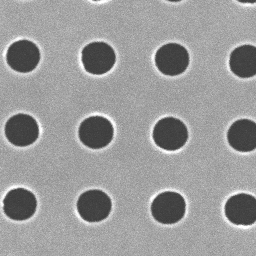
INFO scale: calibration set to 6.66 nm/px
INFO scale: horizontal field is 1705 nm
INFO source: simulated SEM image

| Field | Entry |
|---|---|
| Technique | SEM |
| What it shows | a regular array of holes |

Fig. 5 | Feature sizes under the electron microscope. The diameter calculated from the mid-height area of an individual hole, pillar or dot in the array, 231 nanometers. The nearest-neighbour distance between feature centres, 0.492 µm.